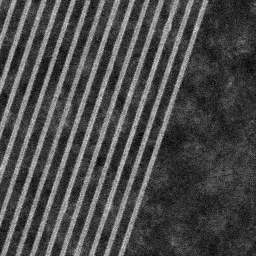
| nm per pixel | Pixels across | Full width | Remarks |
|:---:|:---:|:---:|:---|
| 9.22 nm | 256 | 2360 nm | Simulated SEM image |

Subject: parallel lines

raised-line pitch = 129 nm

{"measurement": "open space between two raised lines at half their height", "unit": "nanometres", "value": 94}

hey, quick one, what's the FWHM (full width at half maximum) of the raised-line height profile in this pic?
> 33.9 nanometres